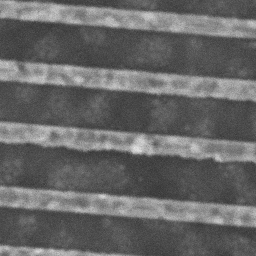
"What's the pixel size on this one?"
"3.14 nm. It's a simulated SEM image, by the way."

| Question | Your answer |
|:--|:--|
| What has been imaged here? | one or a few lines or trenches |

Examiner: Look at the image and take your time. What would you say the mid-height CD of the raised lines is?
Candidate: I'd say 50.8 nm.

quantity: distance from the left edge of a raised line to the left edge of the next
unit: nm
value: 195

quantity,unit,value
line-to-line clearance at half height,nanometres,142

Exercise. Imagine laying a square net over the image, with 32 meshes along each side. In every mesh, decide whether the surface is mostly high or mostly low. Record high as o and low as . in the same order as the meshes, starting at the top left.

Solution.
oooo............................
oooooooooooooooo................
......oooooooooooooooooooooo....
..................oooooooooooooo
..............................oo
................................
................................
................................
ooooooooo.......................
oooooooooooooooooooooo..........
........oooooooooooooooooooooooo
...................o.ooooooooooo
................................
................................
................................
o...............................
ooooooooooooo...................
ooooooooooooooooooooooooo.......
..........ooo.oooooooooooooooooo
........................oooooooo
................................
................................
................................
................................
ooooooooooooo...................
ooooooooooooooooooooooooo.......
............oooooooooooooooooooo
........................oooooooo
................................
................................
................................
ooooooo.........................